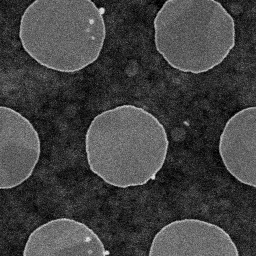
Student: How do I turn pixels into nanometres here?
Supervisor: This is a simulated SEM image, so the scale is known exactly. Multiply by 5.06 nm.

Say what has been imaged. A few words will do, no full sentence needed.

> raised bodies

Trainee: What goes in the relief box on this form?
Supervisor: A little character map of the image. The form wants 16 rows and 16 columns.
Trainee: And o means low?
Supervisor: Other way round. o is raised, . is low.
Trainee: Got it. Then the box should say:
..oooo....oooo..
.ooooo....ooooo.
.ooooo....ooooo.
..oooo....oooo..
................
................
................
oo....oooo....oo
oo...oooooo...oo
oo...ooooo....oo
oo....oooo....oo
o......oo.......
................
................
..oooo....oooo..
..ooooo..oooooo.